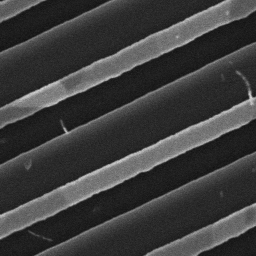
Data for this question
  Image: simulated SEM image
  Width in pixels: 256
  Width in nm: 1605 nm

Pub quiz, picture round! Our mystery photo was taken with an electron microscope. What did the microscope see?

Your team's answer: lines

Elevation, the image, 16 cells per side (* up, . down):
**....**********
....**********..
..**********....
**********....**
********....****
******....******
***.....********
*.....**********
....**********..
..**********....
*********.....**
*******.....****
*****.....******
***.....********
*....**********.
...**********...